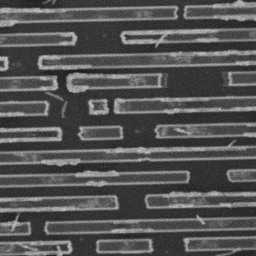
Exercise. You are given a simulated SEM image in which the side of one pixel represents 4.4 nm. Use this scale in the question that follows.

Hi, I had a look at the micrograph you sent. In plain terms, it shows parallel lines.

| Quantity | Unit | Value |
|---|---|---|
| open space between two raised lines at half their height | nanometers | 49.5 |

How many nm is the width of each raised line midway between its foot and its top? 53.4